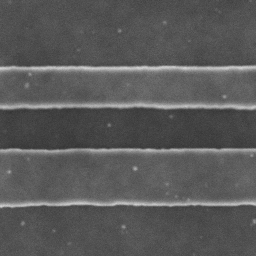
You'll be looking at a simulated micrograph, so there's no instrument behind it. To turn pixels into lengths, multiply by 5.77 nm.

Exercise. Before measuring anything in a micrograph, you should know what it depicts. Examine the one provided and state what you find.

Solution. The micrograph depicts lines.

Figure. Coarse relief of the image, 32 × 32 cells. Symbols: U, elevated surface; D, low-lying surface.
DDDDDDDDDDDDDDDDDDDDDDDDDDDDDDDD
DDDDDDDDDDDDDDDDDDDDDDDDDDDDDDDD
DDDDDDDDDDDDDDDDDDDDDDDDDDDDDDDD
DDDDDDDDDDDDDDDDDDDDDDDDDDDDDDDD
DDDDDDDDDDDDDDDDDDDDDDDDDDDDDDDD
DDDDDDDDDDDDDDDDDDDDDDDDDDDDDDDD
DDDDDDDDDDDDDDDDDDDDDDDDDDDDDDDD
DDDDDDDDDDDDDDDDDDDDDDDDDDDDDDDD
UUUDUUUUUUUUDDUUUUUUUUUUUUUUUUUU
UUUUUUUUUUUUUUUUUUUUUUUUUUUUUUUU
UUUUUUUUUUUUUUUUUUUUUUUUUUUUUUUU
UUUUUUUUUUUUUUUUUUUUUUUUUUUUUUUU
UUUUUUUUUUUUUUUUUUUUUUUUUUUUUUUU
DDDDDDDDDDDDDDDDDDDDDDDDDDDDDDDD
DDDDDDDDDDDDDDDDDDDDDDDDDDDDDDDD
DDDDDDDDDDDDDDDDDDDDDDDDDDDDDDDD
DDDDDDDDDDDDDDDDDDDDDDDDDDDDDDDD
DDDDDDDDDDDDDDDDDDDDDDDDDDDDDDDD
DDDDDDDDDDDDDDDDDDDDDDDDDDDDDDDD
UUUUUUUUUUUUUUUUUUUUUUUUUUUUUUUU
UUUUUUUUUUUUUUUUUUUUUUUUUUUUUUUU
UUUUUUUUUUUUUUUUUUUUUUUUUUUUUUUU
UUUUUUUUUUUUUUUUUUUUUUUUUUUUUUUU
UUUUUUUUUUUUUUUUUUUUUUUUUUUUUUUU
UUUUUUUUUUUUUUUUUUUUUUUUUUUUUUUU
UUUUUUUUUUUUUUUUUUUUUUUUUUUUUUUU
DDDDDDDDDDDDDDDDDDDDDDDDDDDDDDDD
DDDDDDDDDDDDDDDDDDDDDDDDDDDDDDDD
DDDDDDDDDDDDDDDDDDDDDDDDDDDDDDDD
DDDDDDDDDDDDDDDDDDDDDDDDDDDDDDDD
DDDDDDDDDDDDDDDDDDDDDDDDDDDDDDDD
DDDDDDDDDDDDDDDDDDDDDDDDDDDDDDDD